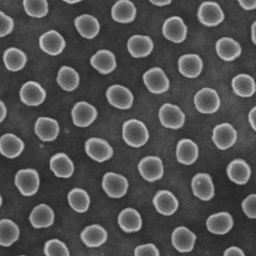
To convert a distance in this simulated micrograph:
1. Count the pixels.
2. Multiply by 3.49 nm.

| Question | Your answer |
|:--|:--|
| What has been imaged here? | a regular array of raised bodies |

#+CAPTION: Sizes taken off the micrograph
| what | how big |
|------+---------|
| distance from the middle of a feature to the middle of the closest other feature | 135 nanometers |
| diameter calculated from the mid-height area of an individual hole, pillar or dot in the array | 82.1 nanometers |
